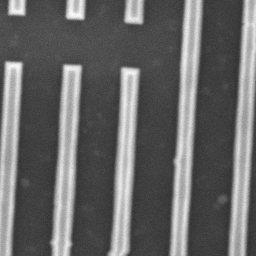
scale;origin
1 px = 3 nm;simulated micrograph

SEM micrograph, parallel lines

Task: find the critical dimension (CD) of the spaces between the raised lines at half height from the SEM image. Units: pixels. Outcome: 44.6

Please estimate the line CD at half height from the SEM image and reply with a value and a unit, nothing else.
41.9 nanometers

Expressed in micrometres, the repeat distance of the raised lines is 0.175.